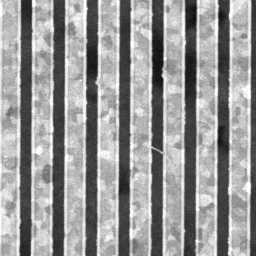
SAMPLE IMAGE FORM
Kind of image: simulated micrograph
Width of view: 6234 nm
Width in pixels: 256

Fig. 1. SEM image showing parallel lines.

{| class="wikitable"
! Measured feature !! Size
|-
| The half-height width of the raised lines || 0.448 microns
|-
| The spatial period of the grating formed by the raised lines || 801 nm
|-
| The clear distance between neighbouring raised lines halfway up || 358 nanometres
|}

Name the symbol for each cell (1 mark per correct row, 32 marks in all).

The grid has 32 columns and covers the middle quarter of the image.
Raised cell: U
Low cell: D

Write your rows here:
DUUUUDDDDUUUUDDDDUUUUUDDDUUUUUDD
DUUUUDDDDUUUUDDDDUUUUUDDDUUUUUDD
DUUUUDDDDUUUUDDDDUUUUUDDDUUUUUDD
DUUUUDDDDUUUUDDDDUUUUUDDDUUUUUDD
DUUUUDDDDUUUUDDDDUUUUUDDDUUUUUDD
DUUUUDDDDUUUUDDDDUUUUDDDDUUUUUDD
DUUUUDDDDUUUUDDDDUUUUDDDDUUUUUDD
DUUUUDDDDUUUUDDDDUUUUDDDDUUUUUDD
DUUUUDDDDUUUUDDDDUUUUDDDDUUUUUDD
DUUUUDDDDUUUUDDDDUUUUDDDDUUUUUDD
DUUUUDDDDUUUUDDDDUUUUDDDDUUUUUDD
DUUUUDDDDUUUUDDDDUUUUDDDDUUUUUDD
DUUUUDDDDUUUUDDDDUUUUDDDDUUUUUDD
DUUUUDDDDUUUUDDDDUUUUDDDDUUUUUDD
DUUUUDDDDUUUUDDDDUUUUDDDDUUUUUDD
DUUUUDDDDUUUUDDDDUUUUDDDDUUUUUDD
DUUUUDDDDUUUUDDDDUUUUDDDDUUUUUDD
DUUUUDDDDUUUUDDDDUUUUUDDDUUUUUDD
DUUUUDDDDUUUUDDDDUUUUDDDDUUUUDDD
DUUUUDDDDUUUUDDDDUUUUDDDDUUUUUDD
DUUUUDDDDUUUUDDDDUUUUUDDDUUUUUDD
DUUUUDDDDUUUUDDDDUUUUDDDDUUUUUDD
DUUUUDDDDUUUUDDDDUUUUDDDDUUUUDDD
DUUUUDDDDUUUUDDDDUUUUDDDDUUUUDDD
DUUUUDDDDUUUUDDDDUUUUDDDDUUUUUDD
DUUUUDDDDUUUUDDDDUUUUDDDDUUUUDDD
DUUUUDDDDUUUUDDDDUUUUDDDDUUUUUDD
DUUUUDDDDUUUUDDDDUUUUDDDDUUUUUDD
DUUUUDDDDUUUUDDDDUUUUDDDDUUUUUDD
DUUUUDDDDUUUUDDDDUUUUDDDDUUUUDDD
UUUUUDDDDUUUUDDDDUUUUDDDDUUUUUDD
UUUUUDDDDUUUUDDDDUUUUDDDDUUUUUDD